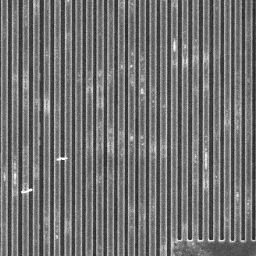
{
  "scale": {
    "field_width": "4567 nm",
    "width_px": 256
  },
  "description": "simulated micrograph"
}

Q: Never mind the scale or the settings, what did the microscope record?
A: parallel lines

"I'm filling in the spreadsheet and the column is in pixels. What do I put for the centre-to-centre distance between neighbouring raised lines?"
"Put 10.6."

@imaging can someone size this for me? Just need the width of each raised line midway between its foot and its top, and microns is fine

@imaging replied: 0.112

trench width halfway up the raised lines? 78 nm